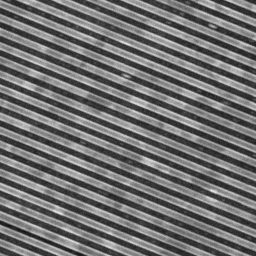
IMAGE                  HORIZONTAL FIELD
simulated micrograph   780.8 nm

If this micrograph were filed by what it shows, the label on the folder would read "parallel lines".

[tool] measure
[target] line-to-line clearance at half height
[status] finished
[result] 20.8 nm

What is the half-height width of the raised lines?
0.0184 microns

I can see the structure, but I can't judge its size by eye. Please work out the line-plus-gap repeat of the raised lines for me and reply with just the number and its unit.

0.0398 microns